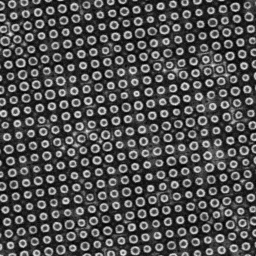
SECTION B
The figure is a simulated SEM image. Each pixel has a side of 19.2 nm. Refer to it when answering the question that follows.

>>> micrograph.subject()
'a regular array of raised bodies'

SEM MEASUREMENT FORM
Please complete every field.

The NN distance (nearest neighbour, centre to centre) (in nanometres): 226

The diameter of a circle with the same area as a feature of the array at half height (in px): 7.22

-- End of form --